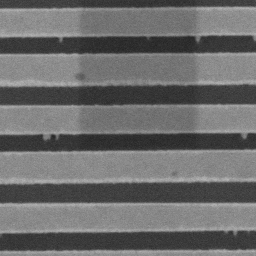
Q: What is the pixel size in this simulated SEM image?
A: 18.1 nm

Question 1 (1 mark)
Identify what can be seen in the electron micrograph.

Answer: lines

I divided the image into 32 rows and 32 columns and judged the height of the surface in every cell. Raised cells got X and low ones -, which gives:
--------------------------------
XXXXXXXXXXXXXXXXXXXXXXXXXXXXXXXX
XXXXXXXXXXXXXXXXXXXXXXXXXXXXXXXX
XXXXXXXXXXXXXXXXXXXXXXXXXXXXXXXX
XXXXXXXXXXX-X-----------X-------
--------------------------------
--------------------------------
XXXXXXXXXXXXXXXXXXXXXXXXXXXXXXXX
XXXXXXXXXXXXXXXXXXXXXXXXXXXXXXXX
XXXXXXXXXXXXXXXXXXXXXXXXXXXXXXXX
XXXXXXXXXXXXXXXXXXXXXXXXX--X----
--------------------------------
--------------------------------
XXXXXXXXXXXXXXXXXXXXXXXXXXXXXXXX
XXXXXXXXXXXXXXXXXXXXXXXXXXXXXXXX
XXXXXXXXXXXXXXXXXXXXXXXXXXXXXXXX
XXXXXXXXXXXXXXXXXXXXXXXXXXXXXXXX
--------------------------------
--------------------------------
XXXXXXXXXXXXXXXXXXXXXXXXXXXXXXXX
XXXXXXXXXXXXXXXXXXXXXXXXXXXXXXXX
XXXXXXXXXXXXXXXXXXXXXXXXXXXXXXXX
XXXXXXXXXXXXXXXXXXXXXXXXXXXXXXXX
--------------------------------
--------------------------------
XXXXXXXXXXXXXXXXXXXXXXXXXXXXXXXX
XXXXXXXXXXXXXXXXXXXXXXXXXXXXXXXX
XXXXXXXXXXXXXXXXXXXXXXXXXXXXXXXX
XXXXXXXXXXXXXXXXXXXXXXXXXXXXXXXX
--------------------------------
--------------------------------
XXXXXXXXXXXXXXXXXXXXXXXXXXXXXXXX